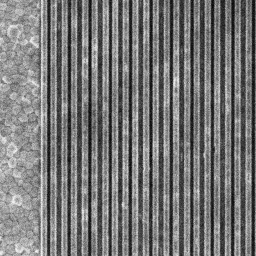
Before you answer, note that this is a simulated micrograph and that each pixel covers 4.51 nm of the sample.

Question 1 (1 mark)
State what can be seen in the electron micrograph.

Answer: parallel lines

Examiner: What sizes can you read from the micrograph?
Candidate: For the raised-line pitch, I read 46.1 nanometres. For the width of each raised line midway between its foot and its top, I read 23.1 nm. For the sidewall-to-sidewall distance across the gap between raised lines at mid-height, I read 0.0192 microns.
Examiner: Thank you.